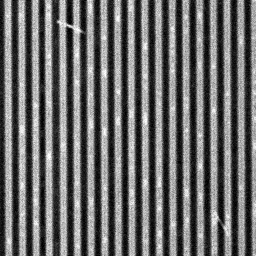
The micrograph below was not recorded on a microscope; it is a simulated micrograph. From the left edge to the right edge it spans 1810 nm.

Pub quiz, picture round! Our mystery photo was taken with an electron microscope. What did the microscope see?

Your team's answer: parallel lines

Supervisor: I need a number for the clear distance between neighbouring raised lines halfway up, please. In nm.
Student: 48.6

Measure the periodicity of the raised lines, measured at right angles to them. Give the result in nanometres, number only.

96.8